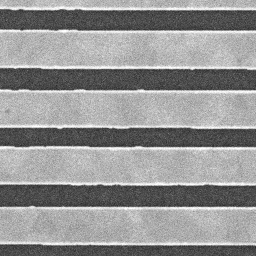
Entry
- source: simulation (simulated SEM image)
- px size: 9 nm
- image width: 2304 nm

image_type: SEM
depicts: lines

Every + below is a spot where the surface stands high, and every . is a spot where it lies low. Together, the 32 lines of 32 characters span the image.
++++++++++++++++++++++++++++++++
................................
................................
................................
++++++++++++++++++++++++++++++++
++++++++++++++++++++++++++++++++
++++++++++++++++++++++++++++++++
++++++++++++++++++++++++++++++++
......++...++++++.++.+++++++++++
................................
................................
+++++++++++++++++++++++++++.+..+
++++++++++++++++++++++++++++++++
++++++++++++++++++++++++++++++++
++++++++++++++++++++++++++++++++
++++++++++++++++++++++++++++++++
................................
................................
++++++++++++++++++++++++++..++++
++++++++++++++++++++++++++++++++
++++++++++++++++++++++++++++++++
++++++++++++++++++++++++++++++++
++++++++++++++++++++++++++++++++
................................
................................
................................
++++++++++++++++++++++++++++++++
++++++++++++++++++++++++++++++++
++++++++++++++++++++++++++++++++
++++++++++++++++++++++++++++++++
......+++...++.+++++++++++++++++
................................